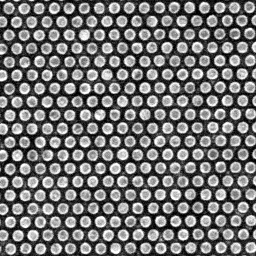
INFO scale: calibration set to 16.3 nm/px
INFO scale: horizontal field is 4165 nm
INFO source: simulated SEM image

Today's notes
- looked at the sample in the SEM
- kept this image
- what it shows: a regular array of raised bodies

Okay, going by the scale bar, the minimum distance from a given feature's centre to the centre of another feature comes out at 240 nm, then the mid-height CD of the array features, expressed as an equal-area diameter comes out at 165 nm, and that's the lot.